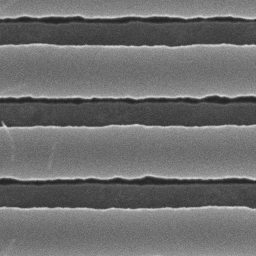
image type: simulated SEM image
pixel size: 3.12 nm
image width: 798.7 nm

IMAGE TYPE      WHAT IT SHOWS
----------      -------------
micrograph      lines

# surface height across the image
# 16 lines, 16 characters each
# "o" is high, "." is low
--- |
oooooooooooooooo
................
................
oooooooooooooooo
oooooooooooooooo
oooooooooooooooo
................
................
oooooooooooooooo
oooooooooooooooo
oooooooooooooooo
................
................
oooooooooooooooo
oooooooooooooooo
oooooooooooooooo